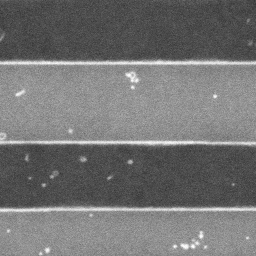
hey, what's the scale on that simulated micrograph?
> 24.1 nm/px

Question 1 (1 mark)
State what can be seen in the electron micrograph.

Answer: lines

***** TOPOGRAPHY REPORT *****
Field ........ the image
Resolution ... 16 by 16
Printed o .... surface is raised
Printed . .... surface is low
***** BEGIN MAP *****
oooooooooooooooo
oooooooooooooooo
oooooooooooooooo
oooooooooooooooo
................
................
................
................
................
oooooooooooooooo
oooooooooooooooo
oooooooooooooooo
oooooooooooooooo
................
................
................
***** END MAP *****